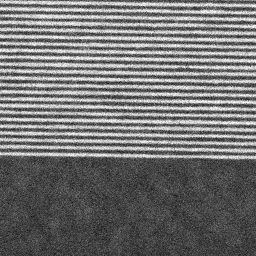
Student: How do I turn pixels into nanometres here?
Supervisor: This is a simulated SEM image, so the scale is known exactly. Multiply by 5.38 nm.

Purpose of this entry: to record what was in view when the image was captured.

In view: parallel lines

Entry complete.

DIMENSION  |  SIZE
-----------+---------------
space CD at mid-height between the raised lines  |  0.0242 µm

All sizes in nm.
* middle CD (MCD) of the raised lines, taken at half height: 12.1